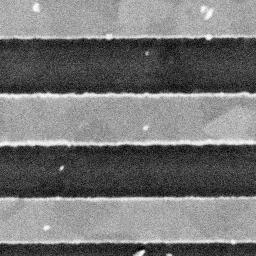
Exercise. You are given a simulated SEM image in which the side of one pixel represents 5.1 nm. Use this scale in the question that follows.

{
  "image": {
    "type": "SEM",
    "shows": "lines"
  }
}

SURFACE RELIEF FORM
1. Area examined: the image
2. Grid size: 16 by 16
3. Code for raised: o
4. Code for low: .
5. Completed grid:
oooooooooooooooo
oooooooooooooooo
................
................
................
................
oooooooooooooooo
oooooooooooooooo
oooooooooooooooo
................
................
................
oooooooooooooooo
oooooooooooooooo
oooooooooooooooo
................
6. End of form